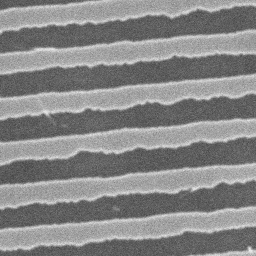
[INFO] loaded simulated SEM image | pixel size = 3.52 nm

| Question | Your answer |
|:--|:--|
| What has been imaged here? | lines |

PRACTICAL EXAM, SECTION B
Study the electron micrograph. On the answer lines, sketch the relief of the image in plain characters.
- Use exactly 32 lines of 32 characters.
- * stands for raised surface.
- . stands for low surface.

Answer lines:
.........***********************
************************........
**************..................
***.............................
.......................*********
..............******************
...*****************************
*******************.............
******..........................
...............................*
....................************
.........***********************
***********************.........
****************................
***.............................
........................********
..............******************
.....************************...
*****************.*.............
*********.......................
*...............................
....................************
........***********************.
*************************.......
*************...................
***.............................
...........................*****
..............******************
...**************************...
*********************...........
***********.....................
..............................**